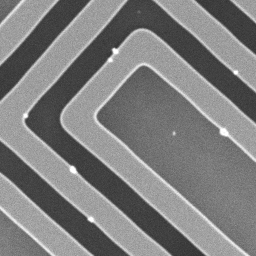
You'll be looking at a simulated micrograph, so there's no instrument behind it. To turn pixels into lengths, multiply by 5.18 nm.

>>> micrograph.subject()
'groups of lines, slits or small figures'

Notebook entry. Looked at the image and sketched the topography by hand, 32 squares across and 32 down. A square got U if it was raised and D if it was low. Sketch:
DDUUUUUDDDDUUUUUDDDDUUUUUDDDDUUU
DUUUUUDDDDUUUUUDDDDDDUUUUUDDDDUU
DUUUUDDDDUUUUUDDDDDDDDUUUUUDDDDD
UUUUDDDDUUUUUDDDDDDDDDDUUUUUDDDD
UUUDDDDUUUUUDDDDUUUUDDDDUUUUUDDD
UUUDDDUUUUUDDDDUUUUUUDDDDUUUUUDD
UUDDDDUUUUDDDDUUUUUUUUDDDDUUUUUU
UDDDDUUUUDDDDUUUUUUUUUUDDDDUUUUU
DDDDUUUUDDDDDUUUUDDUUUUUDDDDDUUU
DDDUUUUUDDDDUUUUDDDDUUUUUDDDDDUU
DDUUUUUDDDDUUUUDDDDDDUUUUUDDDDDU
DUUUUUDDDDUUUUDDDDDDDDUUUUUUDDDD
UUUUUDDDDUUUUUDDDDDDDDDDUUUUUDDD
UUUUDDDDUUUUUDDDDDDDDDDDDUUUUUDD
UUUDDDDDUUUUDDDDDDDDDDDDDDUUUUUD
UUUDDDDDUUUUUDDDDDDDDDDDDDDUUUUU
UUUUDDDDUUUUUUDDDDDDDDDDDDDDUUUU
UUUUUDDDDDUUUUUDDDDDDDDDDDDDDUUU
DUUUUUDDDDDUUUUUDDDDDDDDDDDDDDUU
DDUUUUUDDDDDUUUUUDDDDDDDDDDDDDDU
DDDUUUUUUDDDDUUUUUDDDDDDDDDDDDDD
DDDDUUUUUUDDDDUUUUUDDDDDDDDDDDDD
UDDDDDUUUUUDDDDUUUUUDDDDDDDDDDDD
UUDDDDDUUUUUDDDDUUUUUUDDDDDDDDDD
UUUDDDDDUUUUUDDDDDUUUUUDDDDDDDDD
UUUUDDDDDUUUUUDDDDDUUUUUDDDDDDDD
UUUUUDDDDDUUUUUDDDDDUUUUUDDDDDDD
DDUUUUUDDDDUUUUUDDDDDUUUUUDDDDDD
DDDUUUUUDDDDUUUUUDDDDDUUUUUDDDDD
DDDDUUUUUDDDDUUUUUUDDDDUUUUUDDDD
DDDDDUUUUUDDDDDUUUUUDDDDUUUUUDDD
DDDDDDUUUUUDDDDDUUUUUDDDDUUUUUUD